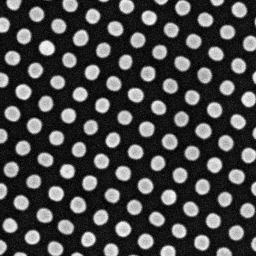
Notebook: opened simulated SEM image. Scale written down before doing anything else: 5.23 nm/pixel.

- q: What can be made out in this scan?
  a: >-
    a regular array of raised bodies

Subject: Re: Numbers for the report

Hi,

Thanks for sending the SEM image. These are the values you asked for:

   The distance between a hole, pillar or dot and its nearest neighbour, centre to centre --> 128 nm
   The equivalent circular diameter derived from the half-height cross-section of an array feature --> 72.9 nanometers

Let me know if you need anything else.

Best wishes